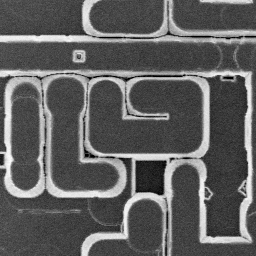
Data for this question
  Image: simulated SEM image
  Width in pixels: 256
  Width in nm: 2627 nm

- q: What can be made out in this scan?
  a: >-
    wiring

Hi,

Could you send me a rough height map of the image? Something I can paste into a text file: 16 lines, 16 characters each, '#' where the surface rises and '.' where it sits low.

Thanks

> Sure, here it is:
.....###########
.....###########
################
################
################
.############...
#############...
#############..#
#############..#
.####.#######...
.#######...##...
.#######...##...
........#####..#
........#####..#
........#####..#
.....###########